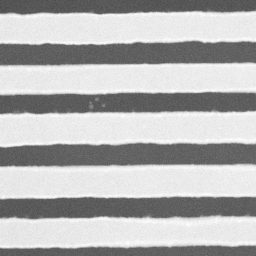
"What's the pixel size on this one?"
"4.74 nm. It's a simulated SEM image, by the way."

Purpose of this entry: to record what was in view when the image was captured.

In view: lines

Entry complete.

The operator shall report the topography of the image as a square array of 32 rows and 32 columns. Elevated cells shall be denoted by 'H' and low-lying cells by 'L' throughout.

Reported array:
LLLLLLLLLLLLLLLLLLLLLLLLLLLLLLLL
LLLLLLLLLLLLLLLLLLLLLLLLHHLLLLLH
HHHHHHHHHHHHHHHHHHHHHHHHHHHHHHHH
HHHHHHHHHHHHHHHHHHHHHHHHHHHHHHHH
HHHHHHHHHHHHHHHHHHHHHHHHHHHHHHHH
LLLHHLLLHHHHHHLLLLLLLLLLLLLLLLLL
LLLLLLLLLLLLLLLLLLLLLLLLLLLLLLLL
LLLLLLLLLLLLLLLLLLLLLLLLLLLLLLLL
HHHHHHHHHHHHHHHHHHHHHHHHHHHHHHHH
HHHHHHHHHHHHHHHHHHHHHHHHHHHHHHHH
HHHHHHHHHHHHHHHHHHHHHHHHHHHHHHHH
HHHHHHHHHHHHHHHHHHHHHHHHHHLHHLHH
LLLLLLLLLLLLLLLLLLLLLLLLLLLLLLLL
LLLLLLLLLLLLLLLLLLLLLLLLLLLLLLLL
HHHHHHHHHHHHHHHHHHHHHHHHHHHHHHHH
HHHHHHHHHHHHHHHHHHHHHHHHHHHHHHHH
HHHHHHHHHHHHHHHHHHHHHHHHHHHHHHHH
HHHHHHHHHHHHHHHHHHHHHHHHHHHHHHHH
LLLLLLLLLLLLLLLLLLLLLLLLLLLLLLLL
LLLLLLLLLLLLLLLLLLLLLLLLLLLLLLLL
LLLLLLLLLLLLLLLLLLLLLLLLLLLLLLLL
HHHHHHHHHHHHHHHHHHHHHHHHHHHHHHHH
HHHHHHHHHHHHHHHHHHHHHHHHHHHHHHHH
HHHHHHHHHHHHHHHHHHHHHHHHHHHHHHHH
HHHHHHHHHHHHHHHHHHHHHHHHHHHHHHHH
LLLLLLLLLLLLLLLLLLLLLLLLLLLLLLLL
LLLLLLLLLLLLLLLLLLLLLLLLLLLLLLLL
HHHHHHHHHHHHHHHHHHHHHHHHHHHHHHHH
HHHHHHHHHHHHHHHHHHHHHHHHHHHHHHHH
HHHHHHHHHHHHHHHHHHHHHHHHHHHHHHHH
HHHHHHHHHHHHHHHHHHHHHHHHHHHHHHHH
LLLLLLLLLLLLLLLLLLLLLLLLLLLLLLLL